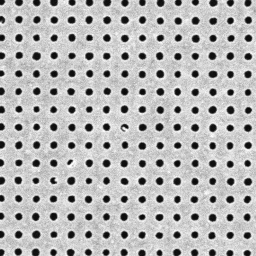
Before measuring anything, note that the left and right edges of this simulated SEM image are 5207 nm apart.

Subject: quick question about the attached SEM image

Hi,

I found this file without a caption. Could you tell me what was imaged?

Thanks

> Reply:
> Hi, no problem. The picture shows a regular array of holes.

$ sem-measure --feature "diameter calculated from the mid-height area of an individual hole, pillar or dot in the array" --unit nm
163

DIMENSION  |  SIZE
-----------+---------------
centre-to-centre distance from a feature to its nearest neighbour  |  354 nm